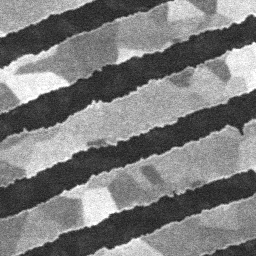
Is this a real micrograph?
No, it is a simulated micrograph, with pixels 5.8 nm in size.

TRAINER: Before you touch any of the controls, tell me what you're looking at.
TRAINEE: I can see one or a few lines or trenches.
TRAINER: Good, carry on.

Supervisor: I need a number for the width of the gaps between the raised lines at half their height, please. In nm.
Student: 167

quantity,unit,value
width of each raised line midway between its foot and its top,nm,233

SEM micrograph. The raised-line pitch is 404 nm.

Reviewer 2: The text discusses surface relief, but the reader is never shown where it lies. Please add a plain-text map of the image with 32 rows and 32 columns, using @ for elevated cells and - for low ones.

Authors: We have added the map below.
@@@@@@@@@@----------@@@@@@@@@@@@
@@@@@@@@----------@@@@@@@@@@@@@@
@@@@@----------@@@@@@@@@@@@@@@--
@@@---------@@@@@@@@@@@@@@@@----
---------@@@@@@@@@@@@@@@--------
-------@@@@@@@@@@@@@@@----------
------@@@@@@@@@@@@@----------@@@
--@@@@@@@@@@@@@@----------@@@@@@
-@@@@@@@@@@@@----------@@@@@@@@@
@@@@@@@@@@@----------@@@@@@@@@@@
@@@@@@@@@---------@@@@@@@@@@@@@@
@@@@@@-----------@@@@@@@@@@@@@@-
@@@@----------@@@@@@@@@@@@@@----
@@---------@@@@@@@@@@@@@@-------
---------@@@@@@@@@@@@@@---------
-------@@@@@@@@@@@@@@----------@
---@@@@@@@@@@@@@@@---------@@@@@
-@@@@@@@@@@@@@@@---------@@@@@@@
@@@@@@@@@@@-----------@@@@@@@@@@
@@@@@@@@@----------@@@@@@@@@@@@@
@@@@@@@----------@@@@@@@@@@@@@@@
@@@@@---------@@@@@@@@@@@@@@@@--
@@---------@@@@@@@@@@@@@@@@-----
---------@@@@@@@@@@@@@@@--------
-------@@@@@@@@@@@@@------------
-----@@@@@@@@@@@@@@----------@@@
---@@@@@@@@@@@-----------@@@@@@@
@@@@@@@@@@@@@----------@@@@@@@@@
@@@@@@@@@@----------@@@@@@@@@@@@
@@@@@@@-----------@@@@@@@@@@@@@@
@@@@@-----------@@@@@@@@@@@@@@--
@@@---------@@@@@@@@@@@@@@@-----